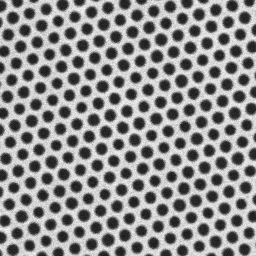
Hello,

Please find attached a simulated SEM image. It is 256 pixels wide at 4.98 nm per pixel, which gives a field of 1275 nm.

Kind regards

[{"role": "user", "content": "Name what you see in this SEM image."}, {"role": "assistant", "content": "a regular array of holes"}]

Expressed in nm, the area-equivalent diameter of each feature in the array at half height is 57.6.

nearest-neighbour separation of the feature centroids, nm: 84.7